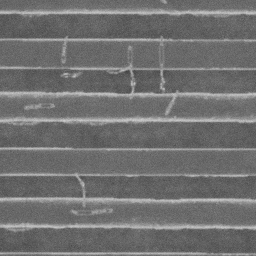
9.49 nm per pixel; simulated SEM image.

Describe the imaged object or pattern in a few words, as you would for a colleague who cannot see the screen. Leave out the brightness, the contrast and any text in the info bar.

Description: lines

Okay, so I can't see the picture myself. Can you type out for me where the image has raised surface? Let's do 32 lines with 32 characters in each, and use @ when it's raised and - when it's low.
@@@@@@@@@@@@@@@@@@@@@@@@@@@@@@@@
@@@@@@@@@@@@@@@@@@@@@@@@@@@@@@@@
--------------------------------
--------------------------------
--------------------------------
@@@@@@@@@@@@@@@@@@@@@@@@@@@@@@@@
@@@@@@@@@@@@@@@@@@@@@@@@@@@@@@@@
@@@@@@@@@@@@@@@@@@@@@@@@@@@@@@@@
--------@@@@@@@@@@@@@@@@@@@@@@@@
--------------------------------
--------------------------------
--------------------------------
@@@@@@@@@@@@@@@@@@@@@@@@@@@@@@@@
@@@@@@@@@@@@@@@@@@@@@@@@@@@@@@@@
@@@@@@@@@@@@@@@@@@@@@@@@@@@@@@@@
--------------------------------
--------------------------------
--------------------------------
--------------------------------
@@@@@@@@@@@@@@@@@@@@@@@@@@@@@@@@
@@@@@@@@@@@@@@@@@@@@@@@@@@@@@@@@
@@@@@@@@@@@@@@@@@@@@@@@@@@@@@@@@
--------------------------------
--------------------------------
--------------------------------
@@@@@@@@@@@@@@@@@@@@@@@@@@@@@@@@
@@@@@@@@@@@@@@@@@@@@@@@@@@@@@@@@
@@@@@@@@@@@@@@@@@@@@@@@@@@@@@@@@
--------------------------------
--------------------------------
--------------------------------
--------------------------------